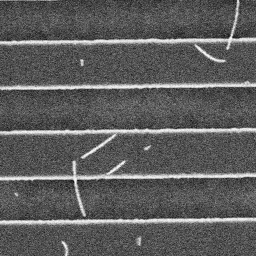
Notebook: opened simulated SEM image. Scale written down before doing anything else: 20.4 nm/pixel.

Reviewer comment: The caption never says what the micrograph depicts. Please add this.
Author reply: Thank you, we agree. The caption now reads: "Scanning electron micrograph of lines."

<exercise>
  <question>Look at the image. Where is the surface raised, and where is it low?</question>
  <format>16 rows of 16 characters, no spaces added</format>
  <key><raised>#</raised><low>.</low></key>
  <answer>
................
................
.............###
################
################
###.............
................
................
################
################
################
................
................
................
################
################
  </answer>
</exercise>